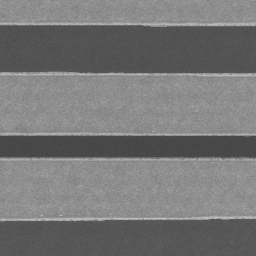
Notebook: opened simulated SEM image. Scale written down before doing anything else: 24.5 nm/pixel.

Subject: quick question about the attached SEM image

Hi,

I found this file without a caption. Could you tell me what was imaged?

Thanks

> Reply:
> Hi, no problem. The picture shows lines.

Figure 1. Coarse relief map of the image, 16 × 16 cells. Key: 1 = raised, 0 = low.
1111111111111111
1111111111111111
0000000000000000
0000000000000000
0000000000000000
1111111111111111
1111111111111111
1111111111111111
0000000000000000
0000000000000000
1111111111111111
1111111111111111
1111111111111111
1111111111111111
0000000000000000
0000000000000000